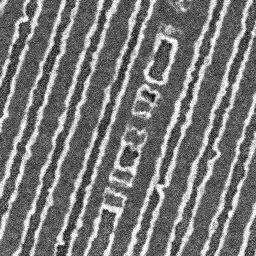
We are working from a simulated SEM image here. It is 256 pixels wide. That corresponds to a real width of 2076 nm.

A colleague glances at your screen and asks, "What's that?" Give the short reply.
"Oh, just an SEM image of parallel lines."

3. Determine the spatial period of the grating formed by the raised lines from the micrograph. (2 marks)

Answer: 287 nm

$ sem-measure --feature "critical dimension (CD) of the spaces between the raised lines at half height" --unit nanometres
105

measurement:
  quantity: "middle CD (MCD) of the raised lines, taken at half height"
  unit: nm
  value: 185